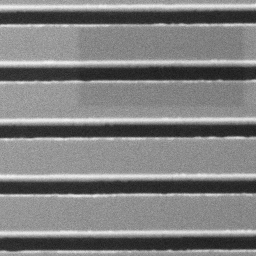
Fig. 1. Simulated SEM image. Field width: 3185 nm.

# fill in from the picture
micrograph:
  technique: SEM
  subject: lines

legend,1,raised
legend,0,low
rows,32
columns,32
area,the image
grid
11111111111111111111111111111111
00000000000000000000000000000000
00000000000000000000000000000000
11111111111111111111111111111111
11111111111111111111111111111111
11111111111111111111111111111111
11111111111111111111111111111111
11111111111111111111111111111111
00000000000000000000000000000000
00000000000000000000000000000000
11111111111111111111111111111111
11111111111111111111111111111111
11111111111111111111111111111111
11111111111111111111111111111111
11111111111111111111111111111111
00000000000000000000000000000000
00000000000000000000000000000000
11111111111111111111111111111111
11111111111111111111111111111111
11111111111111111111111111111111
11111111111111111111111111111111
11111111111111111111111111111111
00000000000000000000000000000000
00000000000000000000000000000000
11111111111111111111111111111111
11111111111111111111111111111111
11111111111111111111111111111111
11111111111111111111111111111111
11111111111111111111111111111111
00000000000000000000000000000000
00000000000000000000000000000000
10111111111111111111111111111111